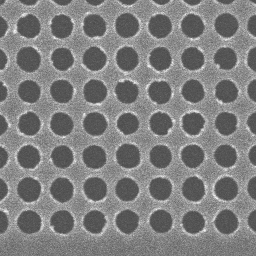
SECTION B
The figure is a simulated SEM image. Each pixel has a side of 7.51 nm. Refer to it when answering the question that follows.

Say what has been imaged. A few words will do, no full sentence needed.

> a regular array of holes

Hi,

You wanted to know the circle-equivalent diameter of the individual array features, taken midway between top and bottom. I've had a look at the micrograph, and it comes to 0.176 microns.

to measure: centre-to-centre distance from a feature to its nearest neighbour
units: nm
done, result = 241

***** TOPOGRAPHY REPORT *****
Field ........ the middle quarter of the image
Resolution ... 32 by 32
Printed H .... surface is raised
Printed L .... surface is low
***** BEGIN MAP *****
LLHHHLLLLLHHHLLLLLHHHHLLLLLHHHLL
LHHHHHLLLHHHHHLLLHHHHHHLLHHHHHHL
HHHHHHHHHHHHHHHHHHHHHHHHHHHHHHHH
HHHHHHHHHHHHHHHHHHHHHHHHHHHHHHHH
LHHHHHLLLHHHHHLLLHHHHHLLLLHHHHLL
LLHHHLLLLLHHHLLLLLHHHLLLLLLHHHLL
LLHHHLLLLLLHHLLLLLLHHLLLLLLHHLLL
LLHHHLLLLLLHHLLLLLLHHLLLLLLHHLLL
LLHHHLLLLLHHHLLLLLHHHLLLLLLHHHLL
LHHHHHLLLHHHHHLLLHHHHHHLLLHHHHHL
HHHHHHHHHHHHHHHHHHHHHHHHHHHHHHHH
HHHHHHHHHHHHHHHHHHHHHHHHHHHHHHHH
HHHHHHLLLHHHHHLLLHHHHHLLLLHHHHLL
LLHHHLLLLLHHHHLLLLHHHHLLLLLHHHLL
LLHHHLLLLLLHHLLLLLLHHLLLLLLHHLLL
LLHHHLLLLLLHHLLLLLLHHHLLLLLHHLLL
LLHHHLLLLLHHHHLLLLHHHHLLLLHHHHLL
LHHHHHLLLLHHHHHLLHHHHHLLLLHHHHHL
HHHHHHHHHHHHHHHHHHHHHHHHHHHHHHHH
HHHHHHHHHHHHHHHHHHHHHHHHHHHHHHHH
LHHHHHLLLHHHHHLLLLHHHHHLLHHHHHLL
LLHHHLLLLLHHHLLLLLLHHHLLLLHHHHLL
LLHHHLLLLLHHHLLLLLLHHLLLLLLHHLLL
LLHHHLLLLLLHHLLLLLLHHLLLLLLHHLLL
LLHHHLLLLLHHHLLLLLLHHHLLLLLHHHLL
LHHHHLLLLLHHHHLLLLHHHHHLLLHHHHHL
HHHHHHHHHHHHHHHHHHHHHHHHHHHHHHHH
HHHHHHHHHHHHHHHHHHHHHHHHHHHHHHHH
LHHHHHLLLHHHHHHLHHHHHHHLLHHHHHHL
LLHHHLLLLLHHHLLLLLHHHHLLLLHHHHLL
LLHHHLLLLLLHHLLLLLHHHLLLLLLHHHLL
LLHHHLLLLLLHHLLLLLLHHLLLLLLHHLLL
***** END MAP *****